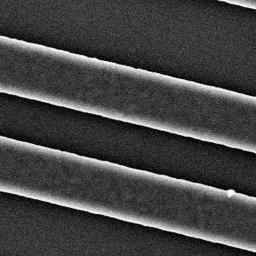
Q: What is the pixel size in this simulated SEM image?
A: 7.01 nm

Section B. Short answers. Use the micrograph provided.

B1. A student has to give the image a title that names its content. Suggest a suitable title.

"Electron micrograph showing lines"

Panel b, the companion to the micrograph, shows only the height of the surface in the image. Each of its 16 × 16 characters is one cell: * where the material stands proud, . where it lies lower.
................
................
*...............
*****...........
*********.......
**************..
...*************
........********
............****
****............
********........
************....
...*************
.......*********
...........*****
...............*